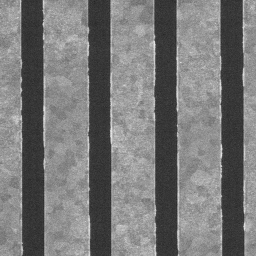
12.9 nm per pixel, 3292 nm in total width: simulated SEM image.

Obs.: lines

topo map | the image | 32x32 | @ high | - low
@@@--@@@@@@---@@@@@---@@@@@---@@
@@@--@@@@@@---@@@@@---@@@@@---@@
@@@--@@@@@@---@@@@@---@@@@@---@@
@@@--@@@@@@---@@@@@---@@@@@---@@
@@@--@@@@@@---@@@@@---@@@@@---@@
@@@---@@@@@---@@@@@---@@@@@---@@
@@@---@@@@@---@@@@@---@@@@@---@@
@@@---@@@@@---@@@@@---@@@@@@---@
@@@---@@@@@---@@@@@---@@@@@@--@@
@@@---@@@@@---@@@@@---@@@@@---@@
@@@---@@@@@---@@@@@---@@@@@@--@@
@@@---@@@@@---@@@@@---@@@@@@---@
@@@---@@@@@---@@@@@---@@@@@@---@
@@@---@@@@@---@@@@@---@@@@@@---@
@@@---@@@@@---@@@@@---@@@@@@---@
@@@---@@@@@---@@@@@---@@@@@@---@
@@@---@@@@@---@@@@@---@@@@@@---@
@@@---@@@@@---@@@@@---@@@@@@---@
@@@---@@@@@---@@@@@---@@@@@@---@
@@@---@@@@@---@@@@@---@@@@@@---@
@@@---@@@@@---@@@@@---@@@@@@---@
@@@---@@@@@---@@@@@---@@@@@@---@
@@@---@@@@@---@@@@@---@@@@@@---@
@@@---@@@@@---@@@@@---@@@@@@---@
@@@---@@@@@---@@@@@---@@@@@@---@
@@@---@@@@@---@@@@@---@@@@@@---@
@@@---@@@@@---@@@@@---@@@@@@---@
@@@---@@@@@---@@@@@---@@@@@@---@
@@@---@@@@@---@@@@@---@@@@@@---@
@@@---@@@@@---@@@@@---@@@@@@---@
@@@---@@@@@---@@@@@---@@@@@@---@
@@@---@@@@@---@@@@@---@@@@@@---@